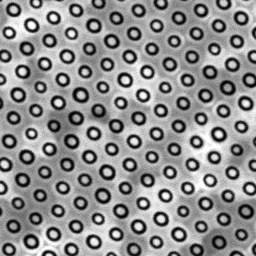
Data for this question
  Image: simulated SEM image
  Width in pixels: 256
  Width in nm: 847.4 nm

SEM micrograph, a regular array of ring-shaped grooves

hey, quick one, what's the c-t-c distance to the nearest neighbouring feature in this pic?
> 77.1 nm